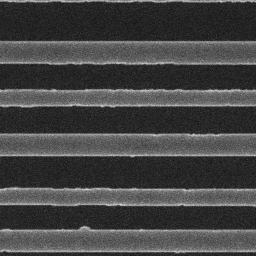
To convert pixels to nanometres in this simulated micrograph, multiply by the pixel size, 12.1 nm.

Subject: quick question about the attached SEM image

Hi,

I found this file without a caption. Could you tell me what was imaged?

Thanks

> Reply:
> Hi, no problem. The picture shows lines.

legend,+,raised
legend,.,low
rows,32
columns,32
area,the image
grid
................................
................................
................................
................................
................................
++++++++++++++++++++++++++++++++
++++++++++++++++++++++++++++++++
++++++++++++++++++++++++++++++++
................................
................................
................................
++++++++++++++++++++++++++++++++
++++++++++++++++++++++++++++++++
................................
................................
................................
................................
++++++++++++++++++++++++++++++++
++++++++++++++++++++++++++++++++
................+...............
................................
................................
................................
.+..............................
++++++++++++++++++++++++++++++++
++++++++++++++++++++++++++++++++
................................
................................
..........+.....................
++++++++++++++++++++++++++++++++
++++++++++++++++++++++++++++++++
......................+.........